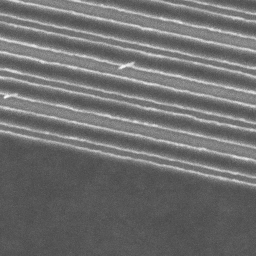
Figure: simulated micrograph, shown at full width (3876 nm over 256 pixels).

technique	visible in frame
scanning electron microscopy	parallel lines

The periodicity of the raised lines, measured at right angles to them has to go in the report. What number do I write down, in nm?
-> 407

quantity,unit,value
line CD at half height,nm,261